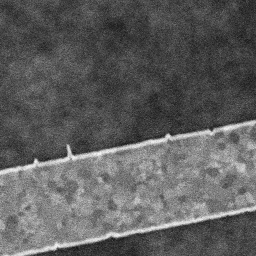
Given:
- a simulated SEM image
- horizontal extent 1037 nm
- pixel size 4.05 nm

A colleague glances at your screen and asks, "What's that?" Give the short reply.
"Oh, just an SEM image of one or a few lines or trenches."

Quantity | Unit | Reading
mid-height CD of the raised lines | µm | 0.34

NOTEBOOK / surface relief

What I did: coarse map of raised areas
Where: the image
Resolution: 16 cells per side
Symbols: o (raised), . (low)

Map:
................
................
................
................
................
................
................
................
...........ooooo
.......ooooooooo
..oooooooooooooo
oooooooooooooooo
oooooooooooooooo
oooooooooooooo..
oooooooo........
ooo.............